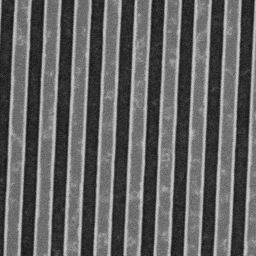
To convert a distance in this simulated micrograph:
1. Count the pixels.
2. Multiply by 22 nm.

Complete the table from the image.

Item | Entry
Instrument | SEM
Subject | parallel lines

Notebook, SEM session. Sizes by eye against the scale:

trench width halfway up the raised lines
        343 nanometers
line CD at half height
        324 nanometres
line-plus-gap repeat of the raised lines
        659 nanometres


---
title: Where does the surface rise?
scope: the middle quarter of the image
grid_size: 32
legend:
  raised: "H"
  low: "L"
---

LLHHHHLLLLHHHLLLLHHHHLLLLHHHLLLL
LLHHHHLLLLHHHLLLLHHHHLLLLHHHLLLL
LLHHHHLLLLHHHLLLLHHHHLLLLHHHLLLL
LLHHHHLLLLHHHLLLLHHHHLLLLHHHLLLL
LLHHHLLLLLHHHLLLLHHHHLLLLHHHLLLL
LLHHHLLLLLHHHLLLLHHHLLLLLHHHLLLL
LLHHHLLLLLHHHLLLLHHHLLLLLHHHLLLL
LLHHHLLLLHHHHLLLLHHHLLLLLHHHLLLL
LLHHHLLLLHHHHLLLLHHHLLLLHHHHLLLL
LLHHHLLLLHHHHLLLLHHHLLLLHHHHLLLL
LLHHHLLLLHHHHLLLLHHHLLLLHHHHLLLL
LLHHHLLLLHHHHLLLLHHHLLLLHHHHLLLL
LLHHHLLLLHHHHLLLLHHHLLLLHHHHLLLL
LLHHHLLLLHHHHLLLLHHHLLLLHHHHLLLL
LLHHHLLLLHHHHLLLLHHHLLLLHHHHLLLL
LLHHHLLLLHHHHLLLLHHHLLLLHHHHLLLL
LLHHHLLLLHHHHLLLLHHHLLLLHHHHLLLL
LLHHHLLLLHHHHLLLLHHHLLLLHHHHLLLL
LLHHHLLLLHHHLLLLLHHHLLLLHHHHLLLL
LLHHHLLLLHHHLLLLLHHHLLLLHHHLLLLL
LLHHHLLLLHHHLLLLLHHHLLLLHHHLLLLL
LHHHHLLLLHHHLLLLLHHHLLLLHHHLLLLL
LHHHHLLLLHHHLLLLHHHHLLLLHHHLLLLH
LHHHHLLLLHHHLLLLHHHHLLLLHHHLLLLH
LHHHHLLLLHHHLLLLHHHHLLLLHHHLLLLH
LHHHHLLLLHHHLLLLHHHHLLLLHHHLLLLH
LHHHHLLLLHHHLLLLHHHHLLLLHHHLLLLH
LHHHLLLLLHHHLLLLHHHHLLLLHHHLLLLH
LHHHLLLLLHHHLLLLHHHHLLLLHHHLLLLH
LHHHLLLLLHHHLLLLHHHLLLLLHHHLLLLH
LHHHLLLLHHHHLLLLHHHLLLLLHHHLLLLH
LHHHLLLLHHHHLLLLHHHLLLLLHHHLLLLH